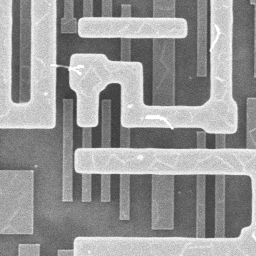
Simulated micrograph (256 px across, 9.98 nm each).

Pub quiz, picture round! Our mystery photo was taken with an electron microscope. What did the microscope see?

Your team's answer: wiring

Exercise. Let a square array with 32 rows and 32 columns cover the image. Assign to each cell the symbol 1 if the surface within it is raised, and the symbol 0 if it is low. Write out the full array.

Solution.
10001110000000000000000000111000
10001110000000000000000000111000
10001110001111111111111000111000
10001110001111111111111000111000
10001110001111111111111000111000
10001110000000000000000000111000
10001110000000000000000000111000
10001110011111000000000000111000
10001110011111111100000000111000
10001110011111111100000000111000
10001110011111011100000000111000
10001110011110011100000000111000
11001110001100011100000000111000
11111110001100011111111111111100
11111110001100011111111111111100
11111110001100011111111111111100
00000000000000000000000000111000
00000000000000000000000000000000
00000000000000000000000000000000
00000000011111111111111111111111
00000000011111111111111111111111
00000000001111111111111111111111
00000000000000000000000000000001
00000000000000000000000000000001
00000000000000000000000000000000
00000000000000000000000000000000
00000000000000000000000000000000
00000000000000000000000000000001
00000000000000000000000000000001
00000000000000000000000000000011
00000000011111111111111111111111
00000000011111111111111111111111